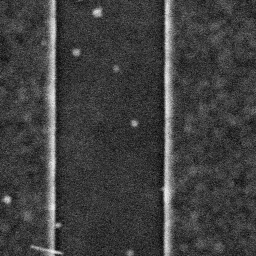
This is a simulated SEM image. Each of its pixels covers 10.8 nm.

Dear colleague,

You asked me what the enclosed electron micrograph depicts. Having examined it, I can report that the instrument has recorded wiring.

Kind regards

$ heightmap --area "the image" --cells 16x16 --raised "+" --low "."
+++.......++++++
+++.......++++++
+++.......++++++
+++.......++++++
+++.......++++++
+++.......++++++
+++.......++++++
+++.......++++++
+++.......++++++
+++.......++++++
+++.......++++++
+++.......++++++
+++.......++++++
+++.......++++++
+++.......++++++
+++.......++++++